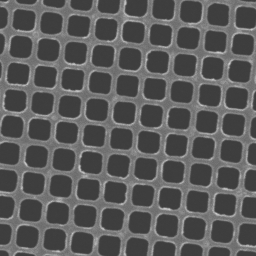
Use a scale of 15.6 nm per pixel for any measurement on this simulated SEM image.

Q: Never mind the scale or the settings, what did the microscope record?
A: a regular array of holes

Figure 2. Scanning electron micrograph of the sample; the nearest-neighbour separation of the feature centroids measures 419 nanometers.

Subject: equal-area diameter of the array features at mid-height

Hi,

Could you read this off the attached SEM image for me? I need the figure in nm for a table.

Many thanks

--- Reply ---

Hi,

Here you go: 372